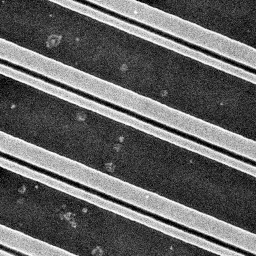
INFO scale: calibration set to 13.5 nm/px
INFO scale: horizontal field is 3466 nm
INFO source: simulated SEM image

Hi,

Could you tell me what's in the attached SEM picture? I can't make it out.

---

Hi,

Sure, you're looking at lines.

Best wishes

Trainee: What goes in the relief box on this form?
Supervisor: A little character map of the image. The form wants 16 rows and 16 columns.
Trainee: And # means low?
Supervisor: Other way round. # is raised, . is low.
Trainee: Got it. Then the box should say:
....######......
.......#####....
.........######.
###.........####
#####.........##
..######........
.....#####......
.......######...
#.........#####.
###.........####
######.........#
...#####........
.....######.....
........#####...
#.........#####.
####.........###